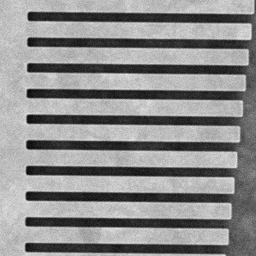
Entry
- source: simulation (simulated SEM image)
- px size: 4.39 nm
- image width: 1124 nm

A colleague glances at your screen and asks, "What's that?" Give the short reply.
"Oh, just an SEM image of groups of lines, slits or small figures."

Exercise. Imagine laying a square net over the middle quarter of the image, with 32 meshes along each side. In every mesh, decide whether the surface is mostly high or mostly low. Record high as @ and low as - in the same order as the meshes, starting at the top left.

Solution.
--------------------------------
--------------------------------
@@@-----------------------------
@@@@@@@@@@@@@@@@@@@@@@@@@@@@@@@@
@@@@@@@@@@@@@@@@@@@@@@@@@@@@@@@@
@@@@@@@@@@@@@@@@@@@@@@@@@@@@@@@@
--------------------------@@@@@@
--------------------------------
--------------------------------
@@@@@@@@@@@@@@@@@@@@@@@@@@@@@@@@
@@@@@@@@@@@@@@@@@@@@@@@@@@@@@@@@
@@@@@@@@@@@@@@@@@@@@@@@@@@@@@@@@
@@@@@@@@@@@@@@@@@@@@@@@@@@@@@@@@
--------------------------------
--------------------------------
@@@@@@@@@@@@@@@@@@--------------
@@@@@@@@@@@@@@@@@@@@@@@@@@@@@@@@
@@@@@@@@@@@@@@@@@@@@@@@@@@@@@@@@
@@@@@@@@@@@@@@@@@@@@@@@@@@@@@@@@
--------------------------------
--------------------------------
--------------------------------
@@@@@@@@@@@@@@@@@@@@@@@@@@@@@@@@
@@@@@@@@@@@@@@@@@@@@@@@@@@@@@@@@
@@@@@@@@@@@@@@@@@@@@@@@@@@@@@@@@
-------------@@@@@@@@@@@@@@@@@@@
--------------------------------
--------------------------------
@@@@@@@@@@@@@@@@@@@@@@@@@@@@@@@@
@@@@@@@@@@@@@@@@@@@@@@@@@@@@@@@@
@@@@@@@@@@@@@@@@@@@@@@@@@@@@@@@@
@@@@@@@@@@@@@@@@@@@@@@@@@@@@@@@@